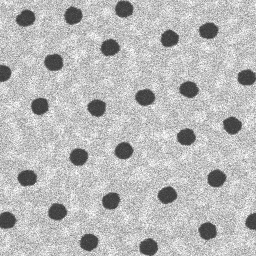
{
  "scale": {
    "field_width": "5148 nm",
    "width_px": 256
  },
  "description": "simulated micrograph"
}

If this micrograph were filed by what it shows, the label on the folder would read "a regular array of holes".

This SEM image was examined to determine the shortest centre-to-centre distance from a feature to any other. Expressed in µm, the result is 0.924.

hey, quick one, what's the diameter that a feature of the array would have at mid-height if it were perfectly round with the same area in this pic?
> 360 nanometres